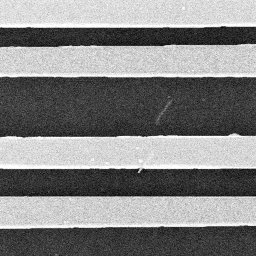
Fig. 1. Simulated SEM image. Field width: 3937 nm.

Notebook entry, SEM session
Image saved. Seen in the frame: lines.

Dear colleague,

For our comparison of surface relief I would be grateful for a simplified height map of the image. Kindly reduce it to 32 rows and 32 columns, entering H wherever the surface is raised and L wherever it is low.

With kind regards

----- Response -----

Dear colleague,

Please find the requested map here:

HHHHHHHHHHHHHHHHHHHHHHHHHHHHHHHH
HHHHHHHHHHHHHHHHHHHHHHHHHHHHHHHH
HHHHHHHHHHHHHHHHHHHHHHHHHHHHHHHH
LLLLLLLLLLLLLLLLLLLLLLLLLLLLLLLL
LLLLLLLLLLLLLLLLLLLLLLLLLLLLLLLL
LLLLLLLLLLLLLLLLLLLLLLLLLLLLLLLL
HHHHHHHHHHHHHHHHHHHHHHHHHHHHHHHH
HHHHHHHHHHHHHHHHHHHHHHHHHHHHHHHH
HHHHHHHHHHHHHHHHHHHHHHHHHHHHHHHH
LLLLLLLLLLLLLLLLLLLLLLLLLLLLLLLL
LLLLLLLLLLLLLLLLLLLLLLLLLLLLLLLL
LLLLLLLLLLLLLLLLLLLLLLLLLLLLLLLL
LLLLLLLLLLLLLLLLLLLLLLLLLLLLLLLL
LLLLLLLLLLLLLLLLLLLLLLLLLLLLLLLL
LLLLLLLLLLLLLLLLLLLLLLLLLLLLLLLL
LLLLLLLLLLLLLLLLLLLLLLLLLLLLLLLL
LLLLLLLLLLLLLLLLLLLLLLLLLLLLLLLL
HHHHHHHHHHHHHHHHHHHHHHHHHHHHHHHH
HHHHHHHHHHHHHHHHHHHHHHHHHHHHHHHH
HHHHHHHHHHHHHHHHHHHHHHHHHHHHHHHH
HHHHHHHHHHHHHHHHHHHHHHHHHHHHHHHH
LLLLLLLLLLLLLLLLLLLLLLLLLLLLLLLL
LLLLLLLLLLLLLLLLLLLLLLLLLLLLLLLL
LLLLLLLLLLLLLLLLLLLLLLLLLLLLLLLL
LLLLLLLLLLLLLLLLLLLLLLLLLLLLLLLL
HHHHHHHHHHHHHHHHHHHHHHHHHHHHHHHH
HHHHHHHHHHHHHHHHHHHHHHHHHHHHHHHH
HHHHHHHHHHHHHHHHHHHHHHHHHHHHHHHH
LLLLLLLLLLLLLLLLLLLLLLLLLLLLLLLL
LLLLLLLLLLLLLLLLLLLLLLLLLLLLLLLL
LLLLLLLLLLLLLLLLLLLLLLLLLLLLLLLL
LLLLLLLLLLLLLLLLLLLLLLLLLLLLLLLL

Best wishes